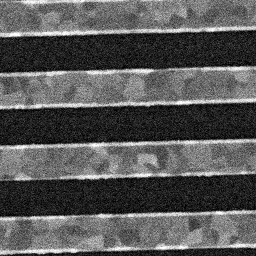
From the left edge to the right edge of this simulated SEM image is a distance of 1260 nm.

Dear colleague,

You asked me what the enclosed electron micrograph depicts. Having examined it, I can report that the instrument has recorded one or a few lines or trenches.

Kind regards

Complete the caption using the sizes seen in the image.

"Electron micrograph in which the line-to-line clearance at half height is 181 nm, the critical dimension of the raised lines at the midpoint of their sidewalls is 0.174 micrometres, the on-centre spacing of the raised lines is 0.355 um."